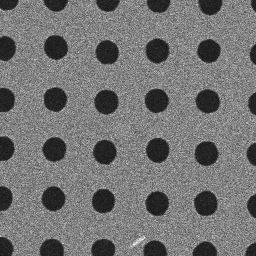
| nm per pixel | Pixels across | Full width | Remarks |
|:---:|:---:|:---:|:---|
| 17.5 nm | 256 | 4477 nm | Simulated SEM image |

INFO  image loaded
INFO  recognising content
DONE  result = a regular array of holes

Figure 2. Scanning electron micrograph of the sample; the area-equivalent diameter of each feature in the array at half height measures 0.427 microns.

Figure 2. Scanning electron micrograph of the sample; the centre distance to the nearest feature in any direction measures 864 nanometres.